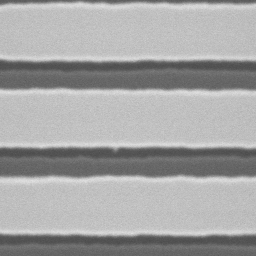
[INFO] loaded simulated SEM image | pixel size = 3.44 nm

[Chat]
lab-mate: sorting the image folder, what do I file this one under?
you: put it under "lines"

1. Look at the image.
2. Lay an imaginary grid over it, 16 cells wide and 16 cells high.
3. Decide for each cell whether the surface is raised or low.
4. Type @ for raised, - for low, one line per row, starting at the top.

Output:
@@@@@@@@@@@@@@@@
@@@@@@@@@@@@@@@@
@@@@@@@@@@@@@@@@
@@@@@@@@@@@@@@@@
----------------
----------------
@@@@@@@@@@@@@@@@
@@@@@@@@@@@@@@@@
@@@@@@@@@@@@@@@@
----------------
----------------
@@@@@@@@@@@@@@@@
@@@@@@@@@@@@@@@@
@@@@@@@@@@@@@@@@
@@@@@@@@@@@@@@@@
----------------